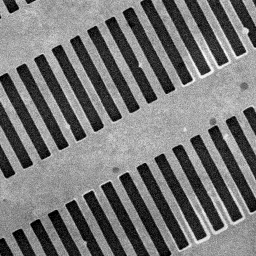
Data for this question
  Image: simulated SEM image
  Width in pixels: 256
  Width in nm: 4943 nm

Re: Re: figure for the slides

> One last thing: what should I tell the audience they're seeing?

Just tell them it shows groups of lines, slits or small figures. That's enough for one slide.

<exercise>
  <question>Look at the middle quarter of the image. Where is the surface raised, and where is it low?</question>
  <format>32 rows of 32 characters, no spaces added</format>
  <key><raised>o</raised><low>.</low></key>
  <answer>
..oo....oo...ooo...ooo...oo....o
...oo...ooo...oo....oo...ooo...o
...ooo...oo....oo...ooo...oo....
....oo....oo...oo....oo...ooo...
o...ooo...oo....oo...ooo...oo...
o....oo...ooo...ooo...oo....oooo
oo....oo...oo....oo...ooo...oooo
ooo...oo....oo...ooo...ooooooooo
.oo...ooo...oo....oo...ooooooooo
.ooo...oo....oo...ooo.oooooooooo
..oo....oo...oo....ooooooooooooo
..ooo...oo....oo...ooooooooooooo
...oo....oo...oooooooooooooooooo
....oo...oo....ooooooooooooooooo
o...oo....oo.ooooooooooooooooooo
o...ooo...oooooooooooooooooooooo
oo...oo..ooooooooooooooooooooooo
oo....oooooooooooooooooooooooooo
ooo..ooooooooooooooooooooooooooo
.ooooooooooooooooooooooooooooooo
.ooooooooooooooooooooooooooo..oo
ooooooooooooooooooooooooooo...oo
oooooooooooooooooooooooo.ooo...o
ooooooooooooooooooooooo...oo...o
ooooooooooooooooooooooo...ooo...
ooooooooooooooooooo..oo....oo...
oooooooooooooooooo....oo...ooo..
ooooooooooooooo.ooo...oo....oo..
oooooooooooooo...oo....oo...ooo.
ooooooooooo.oo...ooo...ooo...oo.
ooooooooo...ooo...oo....oo...ooo
oooooooooo...oo....oo...oo....oo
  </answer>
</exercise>